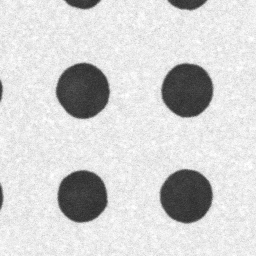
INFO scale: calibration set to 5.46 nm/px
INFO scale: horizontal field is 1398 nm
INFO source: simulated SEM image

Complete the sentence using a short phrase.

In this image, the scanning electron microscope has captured holes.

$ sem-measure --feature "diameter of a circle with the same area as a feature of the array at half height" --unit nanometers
293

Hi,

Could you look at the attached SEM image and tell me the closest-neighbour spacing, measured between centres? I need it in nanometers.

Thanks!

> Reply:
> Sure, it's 569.